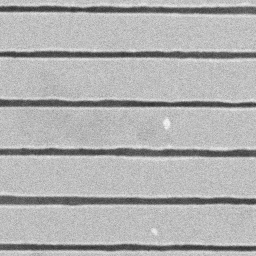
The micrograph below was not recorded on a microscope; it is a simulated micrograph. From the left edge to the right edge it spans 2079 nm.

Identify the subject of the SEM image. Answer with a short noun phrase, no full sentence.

lines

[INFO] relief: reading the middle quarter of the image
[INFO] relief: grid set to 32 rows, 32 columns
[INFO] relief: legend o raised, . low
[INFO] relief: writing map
oooooooooooooooooooooooooooooooo
oooooooooooooooooooooooooooooooo
oooooooooooooooooooooooooooooooo
oooooooooooooooooooooooooooooooo
oooooooooooooooooooooooooooooooo
oooooooooooooooooooooooooooooooo
oooooooooooooooooooooooooooooooo
oooooooooooooooooooooooooooooooo
oooooooooooooooooooooooooooooooo
................................
................................
oooooooooooooooooooooooooooooooo
oooooooooooooooooooooooooooooooo
oooooooooooooooooooooooooooooooo
oooooooooooooooooooooooooooooooo
oooooooooooooooooooooooooooooooo
oooooooooooooooooooooooooooooooo
oooooooooooooooooooooooooooooooo
oooooooooooooooooooooooooooooooo
oooooooooooooooooooooooooooooooo
oooooooooooooooooooooooooooooooo
................................
................................
oooooooooooooooooooooooooooooooo
oooooooooooooooooooooooooooooooo
oooooooooooooooooooooooooooooooo
oooooooooooooooooooooooooooooooo
oooooooooooooooooooooooooooooooo
oooooooooooooooooooooooooooooooo
oooooooooooooooooooooooooooooooo
oooooooooooooooooooooooooooooooo
oooooooooooooooooooooooooooooooo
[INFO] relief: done